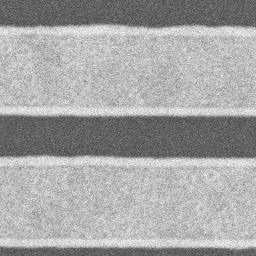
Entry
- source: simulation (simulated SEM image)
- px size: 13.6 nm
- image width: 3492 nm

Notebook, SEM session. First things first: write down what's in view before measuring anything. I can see one or a few lines or trenches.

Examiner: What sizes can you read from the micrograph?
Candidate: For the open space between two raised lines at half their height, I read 699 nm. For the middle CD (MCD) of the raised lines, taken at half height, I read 1.09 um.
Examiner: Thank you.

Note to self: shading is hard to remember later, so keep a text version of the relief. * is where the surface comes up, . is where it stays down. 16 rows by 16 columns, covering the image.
................
................
****************
****************
****************
****************
****************
................
................
................
****************
****************
****************
****************
****************
................